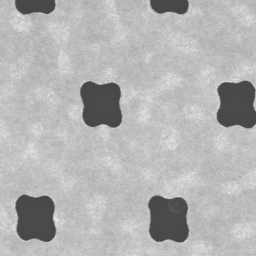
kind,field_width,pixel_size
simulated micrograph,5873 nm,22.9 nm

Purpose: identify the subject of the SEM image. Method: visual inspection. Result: holes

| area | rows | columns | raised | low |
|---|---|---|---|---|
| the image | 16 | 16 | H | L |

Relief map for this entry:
HLLHHHHHHHLLHHHH
HHHHHHHHHHHHHHHH
HHHHHHHHHHHHHHHH
HHHHHHHHHHHHHHHH
HHHHHHHHHHHHHHHH
HHHHHLLHHHHHHHLL
HHHHHLLLHHHHHHLL
HHHHHLLLHHHHHHLL
HHHHHHHHHHHHHHHH
HHHHHHHHHHHHHHHH
HHHHHHHHHHHHHHHH
HHHHHHHHHHHHHHHH
HLLHHHHHHHLHHHHH
HLLHHHHHHLLLHHHH
HLLHHHHHHLLLHHHH
HHHHHHHHHHHHHHHH